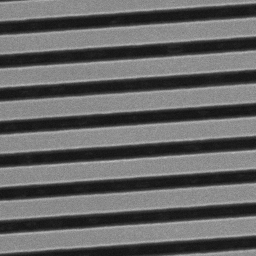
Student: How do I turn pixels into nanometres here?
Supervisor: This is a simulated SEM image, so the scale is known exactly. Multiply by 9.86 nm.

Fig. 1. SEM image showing parallel lines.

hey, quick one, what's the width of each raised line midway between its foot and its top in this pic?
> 205 nanometers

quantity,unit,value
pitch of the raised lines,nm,326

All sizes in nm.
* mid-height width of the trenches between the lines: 126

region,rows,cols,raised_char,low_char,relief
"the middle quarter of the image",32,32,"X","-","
XXXXXXXXXXXXXXXXXXXXXXXXXXXXXXXX
XXXXXXXXXXXXXXXXXXXXXXXXXXXXXXXX
XXXXXXXXXXXXXXXXXXXXXXXXXXXXXXXX
XXXXXXXXXXXXXXXXXXXX------------
XXXXXX--------------------------
--------------------------------
-----------------------X--XXXXXX
---------XXXXXXXXXXXXXXXXXXXXXXX
XXXXXXXXXXXXXXXXXXXXXXXXXXXXXXXX
XXXXXXXXXXXXXXXXXXXXXXXXXXXXXXXX
XXXXXXXXXXXXXXXXXXXXXXXXXXXXXXXX
XXXXXXXXXXXXXXXXXXXXXXX---------
XXXXXXXXX-XX--------------------
--------------------------------
----------------------------XXXX
--------------XXXXXXXXXXXXXXXXXX
XXXXXXXXXXXXXXXXXXXXXXXXXXXXXXXX
XXXXXXXXXXXXXXXXXXXXXXXXXXXXXXXX
XXXXXXXXXXXXXXXXXXXXXXXXXXXXXXXX
XXXXXXXXXXXXXXXXXXXXXXXXXXX-X---
XXXXXXXXXXXXXXX-----------------
X-------------------------------
-------------------------------X
-----------------XXXXXXXXXXXXXXX
---XXXXXXXXXXXXXXXXXXXXXXXXXXXXX
XXXXXXXXXXXXXXXXXXXXXXXXXXXXXXXX
XXXXXXXXXXXXXXXXXXXXXXXXXXXXXXXX
XXXXXXXXXXXXXXXXXXXXXXXXXXXXXXXX
XXXXXXXXXXXXXXXXX---------------
XXX-----------------------------
--------------------------------
-----------------------XXXXXXXXX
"